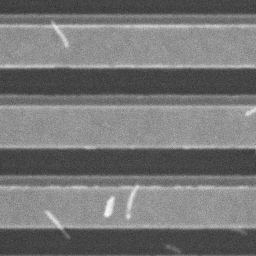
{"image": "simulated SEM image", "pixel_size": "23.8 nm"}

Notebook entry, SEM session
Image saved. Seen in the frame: lines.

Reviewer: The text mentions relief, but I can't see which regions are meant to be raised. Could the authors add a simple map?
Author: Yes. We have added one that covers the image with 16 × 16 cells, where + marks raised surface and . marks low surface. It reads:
................
++++++++++++++++
++++++++++++++++
++++++++++++++++
................
................
++++++++++++++++
++++++++++++++++
++++++++++++++++
................
................
++++++++++++++++
++++++++++++++++
++++++++++++++++
................
................